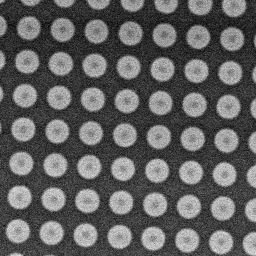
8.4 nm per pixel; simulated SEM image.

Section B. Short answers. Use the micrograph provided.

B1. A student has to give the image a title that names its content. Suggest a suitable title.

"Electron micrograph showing an array of small figures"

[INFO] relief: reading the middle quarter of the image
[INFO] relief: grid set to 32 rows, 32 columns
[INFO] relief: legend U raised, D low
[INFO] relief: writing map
UUDDDUUUUUUDDUUUUUUDDDUUUUUDDDUU
UUDDDUUUUUDDDUUUUUUDDDUUUUUDDDUU
UDDDDDUUUUDDDDUUUUDDDDUUUUUDDDUU
DDDDDDDDDDDDDDDUUDDDDDDUUUUDDDDU
DDDDDDDDDDDDDDDDDDDDDDDDDDDDDDDD
DDDDDDDDDDDDDDDDDDDDDDDDDDDDDDDD
UDDDDUUUUDDDDDDUDDDDDDDDDDDDDDDD
UDDDDUUUUUDDDUUUUUDDDDUUUUDDDDDD
UUDDUUUUUUDDDUUUUUDDDDUUUUUDDDUU
UDDDUUUUUUDDDUUUUUUDDUUUUUUDDDUU
UDDDDUUUUUDDDUUUUUDDDUUUUUUDDDUU
DDDDDDUUUDDDDDUUUUDDDDUUUUDDDDUU
DDDDDDDDDDDDDDDDDDDDDDDUUDDDDDDU
DDDDDDDDDDDDDDDDDDDDDDDDDDDDDDDD
DDDDDDUDDDDDDDDDDDDDDDDDDDDDDDDD
UDDDDUUUUDDDDUUUUDDDDDDUUDDDDDDD
UDDDUUUUUDDDDUUUUUDDDUUUUUDDDDUU
UDDDUUUUUUDDUUUUUUDDDUUUUUUDDDUU
UDDDUUUUUDDDUUUUUUDDDUUUUUUDDUUU
DDDDDUUUUDDDDUUUUUDDDUUUUUDDDUUU
DDDDDDDDDDDDDDUUDDDDDDUUUUDDDDUU
DDDDDDDDDDDDDDDDDDDDDDDDDDDDDDDU
DDDDDDDDDDDDDDDDDDDDDDDDDDDDDDDD
DDDDUUUUDDDDDDUDDDDDDDDDDDDDDDDD
UDDDUUUUUDDDUUUUUDDDDUUUUDDDDDDU
UDDUUUUUUDDDUUUUUUDDDUUUUUDDDUUU
DDDDUUUUUDDDUUUUUUDDUUUUUUDDDUUU
DDDDUUUUUDDDUUUUUDDDUUUUUUDDDUUU
DDDDDUUDDDDDDUUUUDDDDUUUUUDDDUUU
DDDDDDDDDDDDDDDDDDDDDDDUDDDDDDUU
DDDDDDDDDDDDDDDDDDDDDDDDDDDDDDDD
DDDDDUUDDDDDDDDDDDDDDDDDDDDDDDDD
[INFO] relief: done